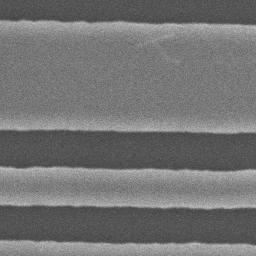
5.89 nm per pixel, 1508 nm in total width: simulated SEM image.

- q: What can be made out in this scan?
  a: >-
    lines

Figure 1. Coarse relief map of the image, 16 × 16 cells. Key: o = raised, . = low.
................
ooooooooooo.o...
oooooooooooooooo
oooooooooooooooo
oooooooooooooooo
oooooooooooooooo
oooooooooooooooo
oooooooooooooooo
................
................
o.oo............
oooooooooooooooo
oooooooooooooooo
................
................
oooooooooooooooo